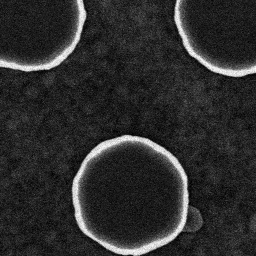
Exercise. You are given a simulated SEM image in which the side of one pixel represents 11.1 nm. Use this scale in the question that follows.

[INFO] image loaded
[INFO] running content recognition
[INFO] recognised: raised bodies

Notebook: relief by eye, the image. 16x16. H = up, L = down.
HHHHHLLLLLLHHHHH
HHHHHLLLLLLHHHHH
HHHHHLLLLLLLHHHH
HHHHLLLLLLLLHHHH
LLLLLLLLLLLLLLHL
LLLLLLLLLLLLLLLL
LLLLLLLLLLLLLLLL
LLLLLLLLLLLLLLLL
LLLLLLLLLLLLLLLL
LLLLLLHHHHLLLLLL
LLLLLHHHHHHLLLLL
LLLLLHHHHHHHLLLL
LLLLLHHHHHHHLLLL
LLLLLHHHHHHHLLLL
LLLLLHHHHHHLLLLL
LLLLLLLHHLLLLLLL